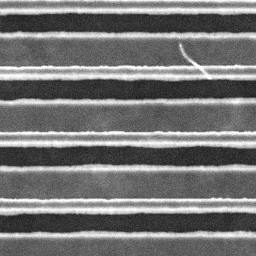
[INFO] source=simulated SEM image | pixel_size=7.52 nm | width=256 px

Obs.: lines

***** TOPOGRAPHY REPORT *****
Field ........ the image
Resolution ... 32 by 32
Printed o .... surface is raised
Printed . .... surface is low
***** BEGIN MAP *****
oooooooooooooooooooooooooooooooo
o..o............................
................................
................................
oooooooooooooooooooooooooooooooo
oooooooooooooooooooooooooooooooo
oooooooooooooooooooooooooooooooo
oooooooooooooooooooooooooooooooo
oooooooooooooooooooooooooooooooo
oooooooooooooooooooooooooooooooo
................................
................................
................................
oooooooooooooooooooooooooooooooo
oooooooooooooooooooooooooooooooo
oooooooooooooooooooooooooooooooo
oooooooooooooooooooooooooooooooo
oooooooooooooooooooooooooooooooo
................................
................................
................................
oooooooooooooooooooooooooooooooo
oooooooooooooooooooooooooooooooo
oooooooooooooooooooooooooooooooo
oooooooooooooooooooooooooooooooo
oooooooooooooooooooooooooooooooo
................................
................................
................................
oooooooooooooooooooooooooooooooo
oooooooooooooooooooooooooooooooo
oooooooooooooooooooooooooooooooo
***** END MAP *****